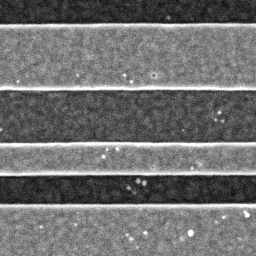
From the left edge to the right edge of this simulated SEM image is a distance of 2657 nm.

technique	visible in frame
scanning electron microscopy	lines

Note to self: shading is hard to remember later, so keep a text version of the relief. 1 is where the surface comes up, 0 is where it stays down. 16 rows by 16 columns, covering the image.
0000000000000000
0000000000000000
1111111111111111
1111111111111111
1111111111111111
1111111110001111
0000000000000000
0000000000000000
0000000000000000
1111111111111111
1111111111111111
0000000000000000
0000000000000000
1111111111111111
1111111111111111
1111111111111111